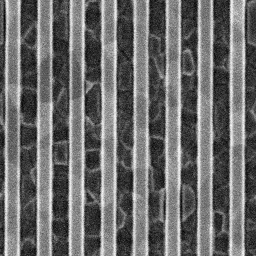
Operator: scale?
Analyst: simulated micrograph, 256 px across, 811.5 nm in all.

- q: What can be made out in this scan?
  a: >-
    parallel lines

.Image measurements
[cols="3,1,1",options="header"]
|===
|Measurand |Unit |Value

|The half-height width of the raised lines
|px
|12.5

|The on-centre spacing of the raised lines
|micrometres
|0.102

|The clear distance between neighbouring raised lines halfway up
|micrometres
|0.0622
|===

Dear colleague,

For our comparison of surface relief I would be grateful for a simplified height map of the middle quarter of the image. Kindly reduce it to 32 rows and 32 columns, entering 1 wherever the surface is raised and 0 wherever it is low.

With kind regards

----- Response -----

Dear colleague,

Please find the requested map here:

00111000001110000011100000111000
00111000001110000011100000111000
00111000001110000011100000111000
00111000001110000011100000111000
00111000001110000011100000111000
00111000001110000011100000111000
00111000001110000011100000111000
00111000001110000011100000111000
00111000001110000011100000111000
00111000001110000011100000111000
00111000001110000011100000111000
00111000001110000011100000111000
00111000001110000011100000111000
00111000001110000011100000111000
00111000001110000011100000111000
00111000001110000011100000111000
00111000001110000011100000111000
00111000001110000011100000111000
00111000001110000011100000111000
00111000001110000011100000111000
00111000001110000011100000111000
00111000001110000011100000111000
00111000001110000011100000111000
00111000001110000011100000111000
00111000001110000011100000111000
00111000001110000011100000111000
00111000001110000011100000111000
00111000001110000011100000111000
00111000001110000011100000111000
00111000001110000011100000111000
00111000001110000011100000111000
00111000001110000011100000111000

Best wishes